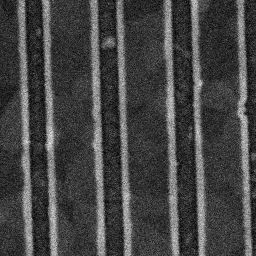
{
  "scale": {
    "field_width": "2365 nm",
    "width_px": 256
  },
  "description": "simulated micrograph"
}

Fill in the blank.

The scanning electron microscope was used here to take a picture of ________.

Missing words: one or a few lines or trenches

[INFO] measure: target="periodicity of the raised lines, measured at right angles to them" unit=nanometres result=681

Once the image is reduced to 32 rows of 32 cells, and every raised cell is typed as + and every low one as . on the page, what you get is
+++...++++++...++++++...++++++..
+++...++++++...++++++...++++++..
+++...++++++...++++++...++++++..
+++...++++++...++++++...++++++..
+++...++++++...++++++...++++++..
+++...++++++...++++++...++++++..
+++...++++++...++++++...++++++..
+++...++++++...++++++...++++++..
+++...++++++...++++++....+++++..
+++...++++++...++++++....+++++..
+++...++++++...++++++....+++++..
+++...++++++...++++++...+++++++.
+++...++++++...++++++....+++++..
+++...++++++...++++++...++++++..
+++...++++++...++++++....+++++..
+++...++++++...+++++++...++++++.
+++...++++++...+++++++...++++++.
+++...++++++...+++++++...++++++.
+++...++++++...+++++++...++++++.
+++...++++++...+++++++...++++++.
+++...++++++....++++++...++++++.
+++...++++++....++++++...++++++.
+++...++++++....++++++...++++++.
+++...+++++++...++++++...++++++.
+++...+++++++...++++++...++++++.
++++..+++++++...++++++...++++++.
++++..+++++++...++++++...++++++.
++++..+++++++...++++++...++++++.
++++...++++++...++++++...++++++.
++++...++++++...++++++...++++++.
++++...++++++...++++++...++++++.
++++...++++++...++++++...++++++.